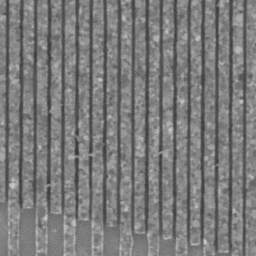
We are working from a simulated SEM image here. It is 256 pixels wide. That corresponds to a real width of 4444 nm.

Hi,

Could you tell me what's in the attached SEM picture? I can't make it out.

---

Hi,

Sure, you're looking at parallel lines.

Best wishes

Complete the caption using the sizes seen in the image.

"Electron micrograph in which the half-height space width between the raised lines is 73.8 nanometers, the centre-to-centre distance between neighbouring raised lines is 242 nm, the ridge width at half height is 163 nanometres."